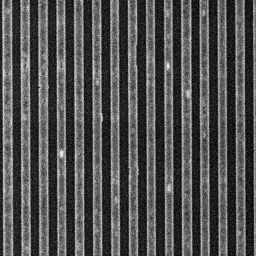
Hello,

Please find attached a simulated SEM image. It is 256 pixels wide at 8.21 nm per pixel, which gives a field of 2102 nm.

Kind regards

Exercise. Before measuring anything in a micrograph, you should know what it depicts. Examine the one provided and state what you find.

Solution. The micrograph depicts parallel lines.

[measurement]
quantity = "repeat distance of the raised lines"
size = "0.147 micrometres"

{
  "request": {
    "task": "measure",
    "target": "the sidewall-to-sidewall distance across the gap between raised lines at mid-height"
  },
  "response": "80.1 nm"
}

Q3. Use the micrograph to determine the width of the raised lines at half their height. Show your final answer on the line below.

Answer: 72.9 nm